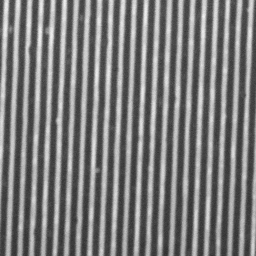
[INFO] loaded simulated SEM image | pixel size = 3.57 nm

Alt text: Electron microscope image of parallel lines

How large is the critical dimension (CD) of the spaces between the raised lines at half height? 0.0272 µm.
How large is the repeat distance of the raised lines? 41.5 nm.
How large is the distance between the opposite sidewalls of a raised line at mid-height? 15.2 nm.